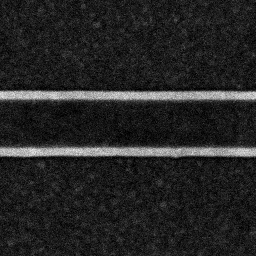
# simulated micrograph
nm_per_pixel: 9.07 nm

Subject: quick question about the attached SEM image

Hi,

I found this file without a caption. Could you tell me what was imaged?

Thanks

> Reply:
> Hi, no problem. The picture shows one or a few lines or trenches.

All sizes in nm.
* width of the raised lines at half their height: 523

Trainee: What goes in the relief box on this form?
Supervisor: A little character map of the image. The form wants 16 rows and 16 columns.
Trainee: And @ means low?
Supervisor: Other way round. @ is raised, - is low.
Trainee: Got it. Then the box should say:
----------------
----------------
----------------
----------------
----------------
----------------
@@@@@@@@@@@@@@@@
@@@@@@@@@@@@@@@@
@@@@@@@@@@@@@@@@
@@@-@@@-@@@@-@@@
----------------
----------------
----------------
----------------
----------------
----------------